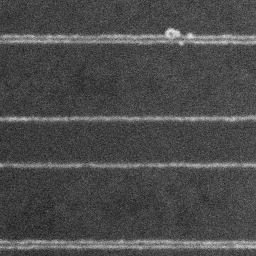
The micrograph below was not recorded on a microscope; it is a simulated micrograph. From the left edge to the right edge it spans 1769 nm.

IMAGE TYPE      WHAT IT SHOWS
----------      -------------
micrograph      lines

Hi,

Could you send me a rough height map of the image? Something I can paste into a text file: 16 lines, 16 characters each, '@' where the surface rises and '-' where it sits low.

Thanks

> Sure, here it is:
----------------
----------------
----------@-----
----------------
----------------
----------------
----------------
@@@@@@@@@@@@@@@@
@@@@@@@@@@@@@@@@
@@@@@@@@@@@@@@@@
----------------
----------------
----------------
----------------
----------------
----------------